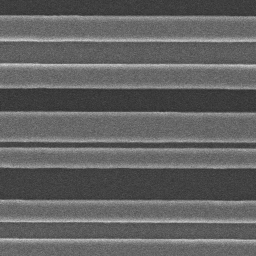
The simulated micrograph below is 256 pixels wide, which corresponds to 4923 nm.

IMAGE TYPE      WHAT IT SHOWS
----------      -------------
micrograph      lines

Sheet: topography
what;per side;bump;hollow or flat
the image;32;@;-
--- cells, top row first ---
--------------------------------
--------------------------------
@@@@@@@@@@@@@@@@@@@@@@@@@@@@@@@@
@@@@@@@@@@@@@@@@@@@@@@@@@@@@@@@@
@@@@@@@@@@@@@@@@@@@@@@@@@@@@@@@@
@@@@@@@@@@@@@@@@@@@@@@@@@@@@@@@@
@@@@@@@@@@@@@@@@@@@@@@@@@@@@@@@@
@@@@@@@@@@@@@@@@@@@@@@@@@@@@@@@@
@@@@@@@@@@@@@@@@@@@@@@@@@@@@@@@@
@@@@@@@@@@@@@@@@@@@@@@@@@@@@@@@@
@@@@@@@@@@@@@@@@@@@@@@@@@@@@@@@@
--------------------------------
--------------------------------
--------------------------------
@@@@@@@@@@@@@@@@@@@@@@@@@@@@@@@@
@@@@@@@@@@@@@@@@@@@@@@@@@@@@@@@@
@@@@@@@@@@@@@@@@@@@@@@@@@@@@@@@@
@@@@@@@@@@@@@@@@@@@@@@@@@@@@@@@@
@@@@@@@@@@@@@@@@@@@@@@@@@@@@@@@@
@@@@@@@@@@@@@@@@@@@@@@@@@@@@@@@@
@@@@@@@@@@@@@@@@@@@@@@@@@@@@@@@@
--------------------------------
--------------------------------
--------------------------------
--------------------------------
@@@@@@@@@@@@@@@@@@@@@@@@@@@@@@@@
@@@@@@@@@@@@@@@@@@@@@@@@@@@@@@@@
@@@@@@@@@@@@@@@@@@@@@@@@@@@@@@@@
@@@@@@@@@@@@@@@@@@@@@@@@@@@@@@@@
@@@@@@@@@@@@@@@@@@@@@@@@@@@@@@@@
@@@@@@@@@@@@@@@@@@@@@@@@@@@@@@@@
@@@@@@@@@@@@@@@@@@@@@@@@@@@@@@@@